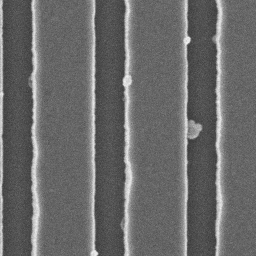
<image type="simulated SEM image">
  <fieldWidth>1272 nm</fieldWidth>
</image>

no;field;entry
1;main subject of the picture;lines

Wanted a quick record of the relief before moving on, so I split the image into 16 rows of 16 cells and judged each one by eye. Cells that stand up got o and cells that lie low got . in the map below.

..oooo..oooo..oo
..oooo..oooo..oo
..oooo..oooo..oo
..oooo..oooo..oo
..oooo..oooo..oo
..oooo..oooo..oo
..oooo..oooo..oo
..oooo..oooo..oo
..oooo..oooo..oo
..oooo..oooo..oo
..oooo..oooo..oo
..oooo..oooo..oo
..oooo..oooo..oo
..oooo..oooo..oo
..oooo..oooo..oo
..oooo..oooo..oo